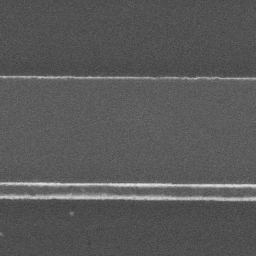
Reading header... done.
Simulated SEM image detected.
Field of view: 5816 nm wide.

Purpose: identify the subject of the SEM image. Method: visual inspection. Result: lines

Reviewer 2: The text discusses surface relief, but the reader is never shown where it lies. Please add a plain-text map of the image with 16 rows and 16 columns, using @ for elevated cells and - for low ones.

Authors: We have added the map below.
----------------
----------------
----------------
----------------
----------------
@@@@@@@@@@@@@@@@
@@@@@@@@@@@@@@@@
@@@@@@@@@@@@@@@@
@@@@@@@@@@@@@@@@
@@@@@@@@@@@@@@@@
@@@@@@@@@@@@@@@@
@@@@@@@@@@@@@@@@
----------------
----------------
----------------
----------------